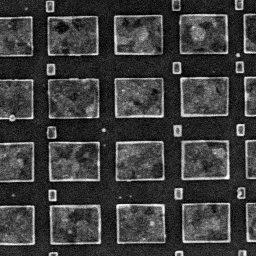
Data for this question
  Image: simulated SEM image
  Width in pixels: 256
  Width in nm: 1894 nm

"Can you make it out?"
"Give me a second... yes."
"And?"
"wiring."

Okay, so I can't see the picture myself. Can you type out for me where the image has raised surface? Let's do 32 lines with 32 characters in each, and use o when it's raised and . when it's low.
......o.........................
................................
oooo..oooooo..oooooo...ooooo...o
oooo..oooooo..oooooo...ooooo...o
oooo..oooooo..oooooo...ooooo...o
oooo..oooooo..oooooo...ooooo...o
oooo..oooooo...ooooo...ooooo...o
................................
......o.........................
................................
oooo..oooooo..oooooo...ooooo...o
oooo..oooooo..oooooo...ooooo...o
oooo..oooooo..oooooo...ooooo...o
oooo..oooooo...ooooo...ooooo...o
oooo..oooooo...oo..o............
................................
......o.........................
......o.........................
oooo..oooooo...ooooo...ooooo...o
oooo..oooooo...ooooo...ooooo...o
oooo..oooooo...ooooo...ooooo...o
oooo..oooooo...ooooo...ooooo...o
oooo...oo..o...oo...............
................................
......o...............o.......o.
................................
oooo..oooooo...ooooo...oooooo..o
oooo..oooooo...ooooo...oooooo..o
oooo..oooooo...oooooo..oooooo..o
oooo..oooooo...oooooo..oooooo..o
................................
................................